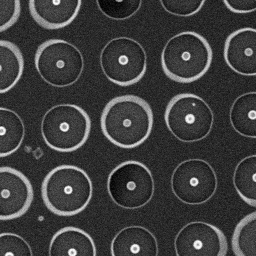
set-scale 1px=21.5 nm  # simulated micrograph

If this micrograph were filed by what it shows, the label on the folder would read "an array of small figures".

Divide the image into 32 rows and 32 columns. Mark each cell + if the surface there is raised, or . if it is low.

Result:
..++......++.....+++.....+++....
..++......+++....++++...++++++++
..+++....+++++++++++++++++++++++
++++++++++++++++++++++++++++++++
++++++++++++++++++++++...++++...
.+++++...+++++...++++.....++....
..+++.....+++.....++......++....
...++.....+++..+..++......++....
...++.....+++.....+++.....+++...
..+++.....+++....++++....+++++++
..+++++..+++++++++++++++++++++++
++++++++++++++++++++++++++++++++
+++++++++++++++..+++++...+++++..
+++++++...+++.....+++.....+++...
..++++.....++......++.....+++..+
...++......++......++.....+++...
...++......++......+++....++++..
...+++....++++....+++++.++++++++
..+++++..+++++++++++++++++++++++
++++++++++++++++++++++++++++++++
++++++++++++++++.++++++...++++..
..+++++...++++.....+++.....++...
...+++.....+++.....+++.....++...
....++.....+++..+..+++.....+++..
+...++.....+++.....+++....++++..
...+++.....++++...++++++++++++++
...++++..+++++++++++++++++++++++
+++++++++++++++++++++++++++++++.
++++++++++++++++..+++++....+++..
..+++++....++++....+++......+...
...+++......++.....+++......+...
....++......++......++......++..